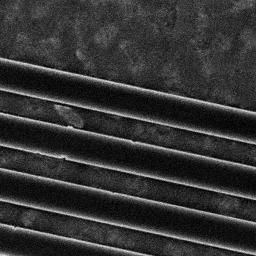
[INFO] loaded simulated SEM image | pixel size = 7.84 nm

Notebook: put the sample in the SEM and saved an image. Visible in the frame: parallel lines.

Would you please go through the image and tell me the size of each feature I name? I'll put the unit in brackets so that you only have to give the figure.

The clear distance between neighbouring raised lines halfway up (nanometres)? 174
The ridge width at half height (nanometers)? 247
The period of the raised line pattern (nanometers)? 424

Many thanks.